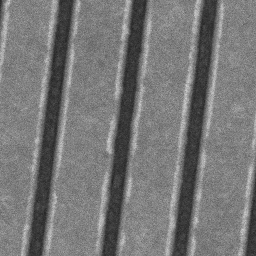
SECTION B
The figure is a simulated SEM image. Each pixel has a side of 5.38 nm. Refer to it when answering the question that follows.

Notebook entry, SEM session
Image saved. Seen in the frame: one or a few lines or trenches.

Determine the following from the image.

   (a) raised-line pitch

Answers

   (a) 385 nm